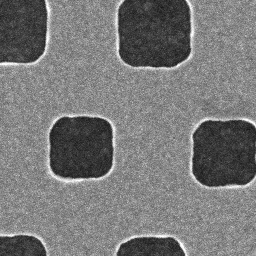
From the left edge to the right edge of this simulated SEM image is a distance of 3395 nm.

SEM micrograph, holes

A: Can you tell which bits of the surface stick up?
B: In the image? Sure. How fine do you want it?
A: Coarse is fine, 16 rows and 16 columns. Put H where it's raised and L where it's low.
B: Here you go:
LLLHHHHLLLLLHHHH
LLLHHHHLLLLLHHHH
LLLHHHHLLLLLHHHH
LLLHHHHHLLLLHHHH
HHHHHHHHHHHHHHHH
HHHHHHHHHHHHHHHH
HHHHHHHHHHHHHHHH
HHHHLLLHHHHHHHHH
HHHLLLLHHHHHLLLL
HHHLLLLHHHHHLLLL
HHHLLLLHHHHHLLLL
HHHHHHHHHHHHHLLH
HHHHHHHHHHHHHHHH
HHHHHHHHHHHHHHHH
HHHHHHHHHHHHHHHH
LLLHHHHLLLLHHHHH